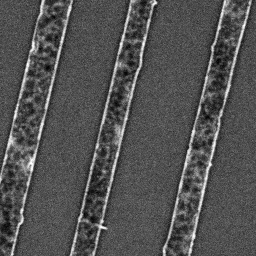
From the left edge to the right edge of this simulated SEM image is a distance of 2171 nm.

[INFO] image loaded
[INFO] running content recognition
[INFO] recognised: one or a few lines or trenches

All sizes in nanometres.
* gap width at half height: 514